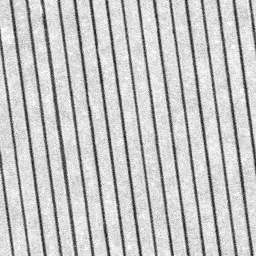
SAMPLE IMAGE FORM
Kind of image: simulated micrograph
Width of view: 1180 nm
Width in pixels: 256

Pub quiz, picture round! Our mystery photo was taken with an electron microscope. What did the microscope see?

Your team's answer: parallel lines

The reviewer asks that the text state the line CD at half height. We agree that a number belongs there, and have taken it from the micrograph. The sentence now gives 54.2 nm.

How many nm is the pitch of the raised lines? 72.7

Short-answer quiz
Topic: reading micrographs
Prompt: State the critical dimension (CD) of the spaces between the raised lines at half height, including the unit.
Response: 16.5 nanometers